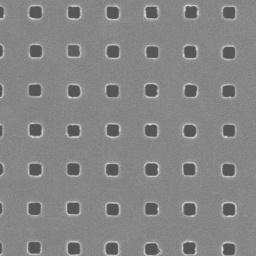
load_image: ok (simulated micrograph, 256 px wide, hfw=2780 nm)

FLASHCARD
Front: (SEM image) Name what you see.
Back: a regular array of holes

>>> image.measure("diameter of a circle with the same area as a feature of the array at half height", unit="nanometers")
143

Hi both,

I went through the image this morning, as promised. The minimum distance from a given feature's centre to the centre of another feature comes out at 38.4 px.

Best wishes